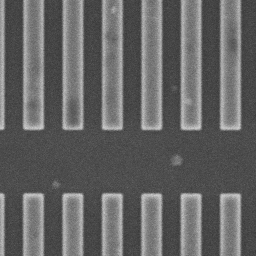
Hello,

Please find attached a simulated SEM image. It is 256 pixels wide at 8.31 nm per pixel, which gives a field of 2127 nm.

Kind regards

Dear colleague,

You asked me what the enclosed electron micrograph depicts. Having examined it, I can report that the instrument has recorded groups of lines, slits or small figures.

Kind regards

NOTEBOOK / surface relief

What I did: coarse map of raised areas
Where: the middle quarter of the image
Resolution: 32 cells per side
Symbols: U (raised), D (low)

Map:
UUUUUDDDDDUUUUUDDDDDUUUUDDDDDDUU
UUUUUDDDDDUUUUUDDDDDUUUUDDDDDDUU
UUUUUDDDDDUUUUUDDDDDUUUUDDDDDDUU
UUUUUDDDDDUUUUUDDDDDUUUUDDDDDDUU
UUUUUDDDDDUUUUUDDDDDUUUUDDDDDDUU
UUUUUDDDDDUUUUUDDDDDUUUUDDDDDDUU
UUUUUDDDDDUUUUUDDDDDUUUUDDDDDDUU
UUUUUDDDDDUUUUUDDDDDUUUUDDDDDDUU
UUUUUDDDDDUUUUUDDDDDUUUUDDDDDDUU
UUUUUDDDDDUUUUDDDDDDUUUUDDDDDDUU
UUUUUDDDDDUUUUDDDDDDUUUUDDDDDDUU
UUUUUDDDDDUUUUDDDDDDUUUUDDDDDDUU
UUUUUDDDDDUUUUDDDDDDUUUUDDDDDDUU
UUUUUDDDDDUUUUDDDDDDUUUUDDDDDDUU
UUUUUDDDDDUUUUDDDDDDUUUUDDDDDDUU
UUUUUDDDDDUUUUDDDDDDUUUUDDDDDDUU
DDDDDDDDDDDDDDDDDDDDDDDDDDDDDDDD
DDDDDDDDDDDDDDDDDDDDDDDDDDDDDDDD
DDDDDDDDDDDDDDDDDDDDDDDDDDDDDDDD
DDDDDDDDDDDDDDDDDDDDDDDDDDDDDDDD
DDDDDDDDDDDDDDDDDDDDDDDDDDDDDDDD
DDDDDDDDDDDDDDDDDDDDDDDDDDDDDDDD
DDDDDDDDDDDDDDDDDDDDDDDDDDDDDDDD
DDDDDDDDDDDDDDDDDDDDDDDDDDDDDDDD
DDDDDDDDDDDDDDDDDDDDDDDDDDDDDDDD
DDDDDDDDDDDDDDDDDDDDDDDDDDDDDDDD
DDDDDDDDDDDDDDDDDDDDDDDDDDDDDDDD
DDDDDDDDDDDDDDDDDDDDDDDDDDDDDDDD
DDDDDDDDDDDDDDDDDDDDDDDDDDDDDDDD
DDDDDDDDDDDDDDDDDDDDDDDDDDDDDDDD
DDDDDDDDDDDDDDDDDDDDDDDDDDDDDDDD
DDDDDDDDDDDDDDDDDDDDDDDDDDDDDDDD